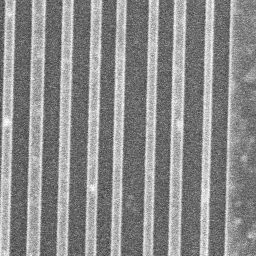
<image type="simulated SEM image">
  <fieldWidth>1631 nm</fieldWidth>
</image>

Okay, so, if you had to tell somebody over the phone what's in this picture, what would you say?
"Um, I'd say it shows parallel lines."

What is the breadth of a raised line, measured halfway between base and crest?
0.0573 um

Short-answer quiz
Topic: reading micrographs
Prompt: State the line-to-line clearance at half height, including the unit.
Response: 114 nanometres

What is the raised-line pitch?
0.181 um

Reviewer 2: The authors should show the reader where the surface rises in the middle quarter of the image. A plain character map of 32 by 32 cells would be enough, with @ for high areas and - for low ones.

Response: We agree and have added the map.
@@-----@@----@@------@@----@@@--
@@-----@@----@@------@@----@@@--
@@-----@@----@@------@@----@@@--
@@-----@@----@@------@@----@@@--
@@-----@@----@@------@@----@@@--
@@-----@@-----@------@@----@@@--
@@-----@@----@@------@@----@@@--
@@----@@@----@@------@@----@@@--
@@----@@@----@@------@@----@@@--
@@----@@@----@@------@@----@@@--
@-----@@@----@@------@@----@@@--
@-----@@@----@@------@@----@@@--
@-----@@@----@@------@@----@@@--
@-----@@@----@@------@@----@@@--
@-----@@@----@@------@@----@@@--
@-----@@@----@@------@@----@@@--
@-----@@@----@@------@@----@@@--
@-----@@-----@@------@@----@@---
@-----@@-----@-------@@----@@---
@-----@@-----@-------@@----@@---
@-----@@-----@-------@@----@@---
@-----@@-----@------@@-----@@---
@-----@@-----@@-----@@-----@@---
@-----@@-----@@-----@@-----@@---
@-----@@-----@@-----@@-----@@---
@-----@@----@@------@@-----@@---
@-----@@----@@------@@-----@@---
@-----@@----@@------@@-----@@---
@-----@@----@@-------@-----@@---
@-----@@----@@-------@-----@@---
@-----@@----@@-------@-----@@---
@-----@@----@@------@@-----@@---